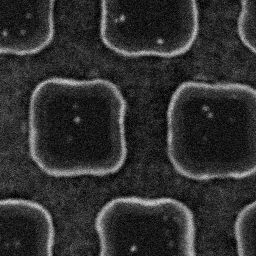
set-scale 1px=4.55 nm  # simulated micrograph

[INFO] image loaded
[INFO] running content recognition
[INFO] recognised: raised bodies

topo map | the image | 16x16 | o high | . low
ooo...oooooo...o
ooo...oooooo...o
ooo...oooooo...o
................
................
..ooooo....oooo.
..oooooo...ooooo
..oooooo...ooooo
..oooooo...ooooo
..oooooo...ooooo
...oooo....ooooo
................
.......oo.o.....
ooo...oooooo...o
ooo...oooooo...o
ooo...oooooo...o